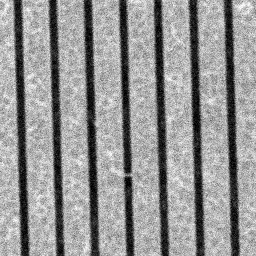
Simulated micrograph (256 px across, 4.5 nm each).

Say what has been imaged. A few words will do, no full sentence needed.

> parallel lines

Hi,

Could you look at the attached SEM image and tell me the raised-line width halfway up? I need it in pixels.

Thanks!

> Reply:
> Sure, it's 25.5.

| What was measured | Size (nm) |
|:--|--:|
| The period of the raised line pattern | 158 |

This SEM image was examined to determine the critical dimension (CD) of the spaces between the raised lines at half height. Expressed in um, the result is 0.041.